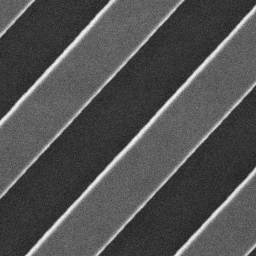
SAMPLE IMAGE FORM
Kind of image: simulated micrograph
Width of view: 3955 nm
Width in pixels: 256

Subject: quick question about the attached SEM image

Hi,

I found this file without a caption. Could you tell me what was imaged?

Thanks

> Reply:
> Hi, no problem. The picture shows lines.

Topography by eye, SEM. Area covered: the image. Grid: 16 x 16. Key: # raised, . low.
##.....####.....
#.....####.....#
.....####.....##
....####.....###
...####.....####
..####.....#####
.####.....#####.
#####....#####..
####.....####...
###.....####....
##.....####.....
#.....####.....#
.....####.....##
....####.....###
...####.....####
..#####....#####